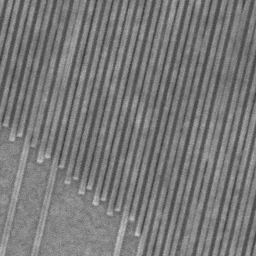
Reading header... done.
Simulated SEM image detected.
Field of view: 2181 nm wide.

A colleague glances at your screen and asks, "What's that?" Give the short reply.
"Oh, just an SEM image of parallel lines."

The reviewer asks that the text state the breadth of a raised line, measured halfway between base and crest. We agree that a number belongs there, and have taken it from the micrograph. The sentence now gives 41.5 nm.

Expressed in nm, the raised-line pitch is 68.1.